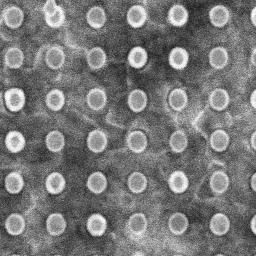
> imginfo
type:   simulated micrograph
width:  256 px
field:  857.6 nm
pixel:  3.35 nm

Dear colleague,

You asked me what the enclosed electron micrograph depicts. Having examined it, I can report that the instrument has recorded a regular array of raised bodies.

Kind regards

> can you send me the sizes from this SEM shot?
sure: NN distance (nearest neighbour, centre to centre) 0.136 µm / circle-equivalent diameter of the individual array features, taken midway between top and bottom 0.064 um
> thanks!